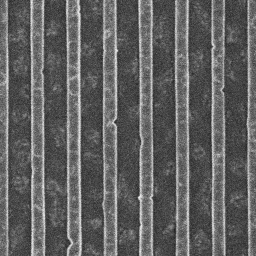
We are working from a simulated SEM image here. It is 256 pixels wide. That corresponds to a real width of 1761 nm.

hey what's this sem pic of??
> parallel lines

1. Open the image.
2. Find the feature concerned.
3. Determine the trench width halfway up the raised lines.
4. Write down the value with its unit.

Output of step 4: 162 nm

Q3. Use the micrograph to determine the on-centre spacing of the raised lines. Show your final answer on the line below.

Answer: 0.248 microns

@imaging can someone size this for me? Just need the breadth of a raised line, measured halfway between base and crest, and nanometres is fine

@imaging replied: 86.8